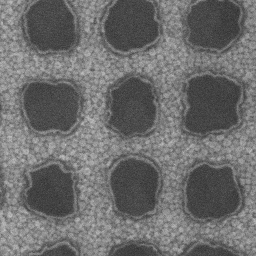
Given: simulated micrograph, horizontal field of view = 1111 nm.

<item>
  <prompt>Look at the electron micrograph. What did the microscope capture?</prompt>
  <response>raised bodies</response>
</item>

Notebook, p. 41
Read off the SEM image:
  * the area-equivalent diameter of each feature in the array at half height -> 57.2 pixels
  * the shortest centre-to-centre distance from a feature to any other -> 341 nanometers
